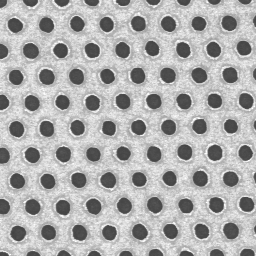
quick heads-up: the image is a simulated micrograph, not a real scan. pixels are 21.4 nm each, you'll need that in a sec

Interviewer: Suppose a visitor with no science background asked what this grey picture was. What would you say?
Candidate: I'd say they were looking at a regular array of holes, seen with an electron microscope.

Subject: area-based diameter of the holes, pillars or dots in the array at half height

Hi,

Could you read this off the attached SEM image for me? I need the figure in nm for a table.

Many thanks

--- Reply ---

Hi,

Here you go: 332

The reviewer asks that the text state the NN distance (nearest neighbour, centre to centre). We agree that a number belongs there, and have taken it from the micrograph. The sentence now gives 633 nm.